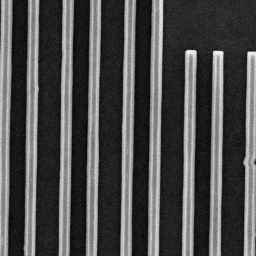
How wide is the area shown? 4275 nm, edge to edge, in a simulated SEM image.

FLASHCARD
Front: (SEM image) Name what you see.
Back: parallel lines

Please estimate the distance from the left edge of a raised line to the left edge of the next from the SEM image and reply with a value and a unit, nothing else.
515 nanometers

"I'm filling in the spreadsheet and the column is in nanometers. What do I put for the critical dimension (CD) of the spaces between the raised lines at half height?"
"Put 326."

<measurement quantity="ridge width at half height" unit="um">0.132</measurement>